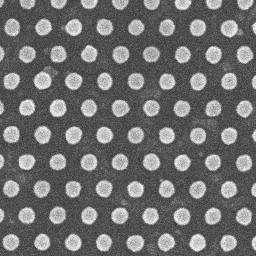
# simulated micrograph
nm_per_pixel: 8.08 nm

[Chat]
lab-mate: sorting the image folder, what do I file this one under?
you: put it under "a regular array of raised bodies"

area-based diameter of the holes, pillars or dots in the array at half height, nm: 124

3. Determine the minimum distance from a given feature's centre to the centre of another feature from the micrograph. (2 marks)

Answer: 248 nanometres